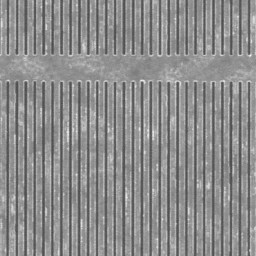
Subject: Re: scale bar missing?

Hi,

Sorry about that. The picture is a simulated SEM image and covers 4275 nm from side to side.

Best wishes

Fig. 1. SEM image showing parallel lines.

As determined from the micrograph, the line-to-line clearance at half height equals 0.0585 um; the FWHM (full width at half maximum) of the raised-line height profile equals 94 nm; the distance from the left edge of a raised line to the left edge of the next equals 149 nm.